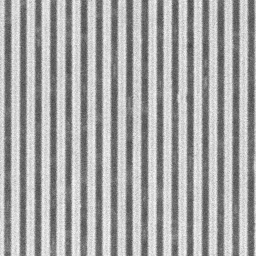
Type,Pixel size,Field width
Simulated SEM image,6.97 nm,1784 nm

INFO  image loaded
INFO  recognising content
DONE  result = parallel lines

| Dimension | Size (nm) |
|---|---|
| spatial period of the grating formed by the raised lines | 106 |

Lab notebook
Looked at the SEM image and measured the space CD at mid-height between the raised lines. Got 0.0523 µm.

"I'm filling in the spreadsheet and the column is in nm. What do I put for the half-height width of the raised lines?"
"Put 53.1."